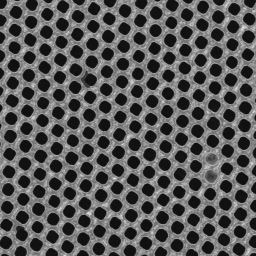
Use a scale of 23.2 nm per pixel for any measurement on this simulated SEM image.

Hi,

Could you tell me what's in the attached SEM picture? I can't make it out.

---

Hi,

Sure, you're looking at a regular array of holes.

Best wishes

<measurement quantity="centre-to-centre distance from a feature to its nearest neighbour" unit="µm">0.407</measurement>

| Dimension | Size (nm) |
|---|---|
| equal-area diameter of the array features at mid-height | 295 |